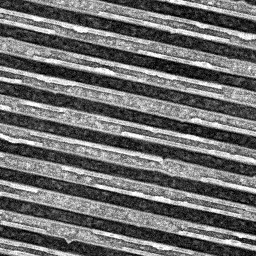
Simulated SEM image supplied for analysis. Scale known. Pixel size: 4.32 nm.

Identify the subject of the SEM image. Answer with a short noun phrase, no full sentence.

parallel lines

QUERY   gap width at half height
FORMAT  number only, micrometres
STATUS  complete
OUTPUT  0.0607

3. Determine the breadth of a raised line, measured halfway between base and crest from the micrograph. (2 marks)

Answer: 0.0612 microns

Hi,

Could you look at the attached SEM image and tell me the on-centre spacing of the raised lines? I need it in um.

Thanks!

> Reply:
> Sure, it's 0.122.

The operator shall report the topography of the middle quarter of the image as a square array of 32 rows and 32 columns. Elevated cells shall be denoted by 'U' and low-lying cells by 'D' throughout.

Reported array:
UUUUUUUUUUUUUUUUUDDDDDDDDDDDDDDD
DDDDDUUUUUUUUUUUUUUUUDDDDDDDDDDD
DDDDDDDDDDDUUUUUUUUUUUUUUUDDDDDD
DDDDDDDDDDDDDDDUUUUUUUUUUUUUUUDD
UUUDDDDDDDDDDDDDDDDDUUUUUUUUUUUU
UUUUUUUDDDDDDDDDDDDDDDDDUUUUUUUU
UUUUUUUUUUUUDDDDDDDDDDDDDDDDDUUU
UUUUUUUUUUUUUUUUUDDDDDDDDDDDDDDD
DDDDDUUUUUUUUUUUUUUUUDDDDDDDDDDD
DDDDDDDDDDUUUUUUUUUUUUUUUUDDDDDD
DDDDDDDDDDDDDDUUUUUUUUUUUUUUUUDD
UUDDDDDDDDDDDDDDDDDUUUUUUUUUUUUU
UUUUUUDDDDDDDDDDDDDDDDDUUUUUUUUU
UUUUUUUUUUUDDDDDDDDDDDDDDDDUUUUU
UUUUUUUUUUUUUUUDDDDDDDDDDDDDDDDU
DDDDUUUUUUUUUUUUUUUUDDDDDDDDDDDD
DDDDDDDDUUUUUUUUUUUUUUUUUDDDDDDD
DDDDDDDDDDDDDUUUUUUUUUUUUUUUUDDD
UDDDDDDDDDDDDDDDDDUUUUUUUUUUUUUU
UUUUUDDDDDDDDDDDDDDDDDDUUUUUUUUU
UUUUUUUUUUDDDDDDDDDDDDDDDDDDUUUU
UUUUUUUUUUUUUUUDDDDDDDDDDDDDDDDD
DDDUUUUUUUUUUUUUUUUUDDDDDDDDDDDD
DDDDDDDUUUUUUUUUUUUUUUUUDDDDDDDD
DDDDDDDDDDDDUUUUUUUUUUUUUUUUDDDD
DDDDDDDDDDDDDDDDDUUUUUUUUUUUUUUU
UUUUDDDDDDDDDDDDDDDDDDDUUUUUUUUU
UUUUUUUUUDDDDDDDDDDDDDDDDDUUUUUU
UUUUUUUUUUUUUDDDDDDDDDDDDDDDDDDU
DDUUUUUUUUUUUUUUUUDDDDDDDDDDDDDD
DDDDDDUUUUUUUUUUUUUUUUUDDDDDDDDD
DDDDDDDDDDDUUUUUUUUUUUUUUUUDDDDD